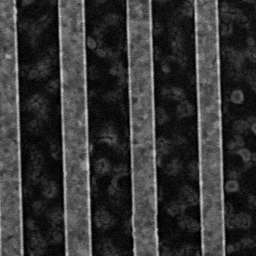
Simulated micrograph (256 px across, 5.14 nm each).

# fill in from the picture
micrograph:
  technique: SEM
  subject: one or a few lines or trenches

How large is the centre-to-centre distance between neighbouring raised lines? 347 nm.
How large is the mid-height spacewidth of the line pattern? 228 nanometres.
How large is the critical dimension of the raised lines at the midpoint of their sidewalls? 119 nm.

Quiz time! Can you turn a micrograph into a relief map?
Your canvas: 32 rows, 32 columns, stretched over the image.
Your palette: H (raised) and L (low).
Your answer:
HHLLLLLHHHLLLLLLHHHLLLLLHHHLLLLL
HHLLLLLHHHLLLLLLHHHLLLLLHHHLLLLL
HHLLLLLHHHLLLLLLHHHLLLLLHHHLLLLL
HHLLLLLLHHHLLLLLHHHLLLLLLHHLLLLL
HHLLLLLLHHHLLLLLHHHLLLLLLHHLLLLL
HHLLLLLLHHHHLLLLHHHLLLLLLHHLLLLL
HHLLLLLLHHHLLLLLHHHLLLLLLHHLLLLL
HHLLLLLLHHHLLLLLHHHLLLLLLHHLLLLL
HHLLLLLLHHHLLLLLHHHLLLLLLHHLLLLL
HHLLLLLLHHHLLLLLHHHLLLLLLHHLLLLL
HHLLLLLLHHHLLLLLHHHLLLLLLHHLLLLL
HHLLLLLLHHHLLLLLHHHLLLLLLHHLLHLL
HHLLLLLLHHHLLLLLHHHLLLLLLHHLLHLL
HHLLLLLLHHHLLLLLHHHLLLLLLHHLLLLL
HHLLLLLLHHHLLLLLHHHLLLLLLHHHLLLL
HHLLLLLLHHHLLLLLHHHLLLLLLHHHLLLL
HHLLLLLLHHHLLLLLHHHLLLLLLHHHLLLL
HHLLLLLLHHHLLLLLHHHLLLLLLHHHLLLL
HHLLLLLLHHHLLLLLLHHLLLLLLHHHLLLL
HHLLLLLLHHHLLLLLLHHLLLLLLHHHLLHL
HHLLLLLLHHHLLLLLLHHLLLLLLHHHLLLL
HHLLLLLLHHHLLLLLLHHLLLLLLHHHLLLL
HHHLLLLLHHHLLLLLLHHLLLLLLHHHLLLL
HHHLLLLLHHHLLLLLLHHLLLLLLHHHHLLL
HHHLLLLLHHHLLLLLLHHLLLLLLHHHLLLL
HHHLLLLLHHHLLLLLLHHHLLLLLHHHLLLL
HHHLLLLLHHHLLLLLLHHHLLLLLHHHLLLL
HHHLLLLLHHHLLLLLLHHLLLLLLHHHLLLL
HHHLLLLLHHHLLLLLLHHHLLLLLHHHLLLL
HHHLLLLLHHHLLLLLLHHHLLLLLHHHLLLL
HHHLLLLLHHHLLLLLLHHHLLLLLHHHLLLL
HHHLLLLLHHHLLLLLLHHHLLLLLHHHLLLL